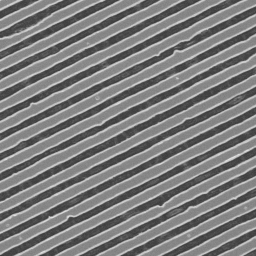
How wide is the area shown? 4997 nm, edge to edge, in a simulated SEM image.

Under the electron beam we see parallel lines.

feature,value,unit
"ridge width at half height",181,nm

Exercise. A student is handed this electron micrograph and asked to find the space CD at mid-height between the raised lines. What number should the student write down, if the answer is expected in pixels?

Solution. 8.5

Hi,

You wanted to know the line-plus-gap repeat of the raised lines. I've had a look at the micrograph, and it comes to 354 nanometres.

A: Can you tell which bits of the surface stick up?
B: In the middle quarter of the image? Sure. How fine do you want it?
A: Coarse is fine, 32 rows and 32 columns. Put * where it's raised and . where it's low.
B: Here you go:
..****......*****.....*****.....
*****.....*****.....*****.....**
**......*****.....*****.....****
......*****.....*****.....******
....*****.....*****.....******..
..*****.....*****......*****....
*****.....*****.....******.....*
***.....*****.....*****......***
*.....*****.....*****......****.
....*****.....*****.....******..
..*****.....*****.....******....
******....*****.....******.....*
***.....*****.....*****.....****
*.....*****.....*****.....******
....******....*****......*****..
..*****.....*****.....******....
*****.....*****.....******.....*
***.....*****......*****....****
*.....*****......****.....******
....******.....****.....******..
..*****......****......*****....
*****......*****.....*****.....*
***.....******.....*****.....***
**.....****......*****.....*****
....*****......*****.....*****..
..*****......*****.....*****....
******.....*****.....*****.....*
****.....*****.....*****.....***
**.....*****.....*****.....*****
.....*****.....*****.....*****..
..******.....*****.....*****....
.*****.....*****.....*****.....*